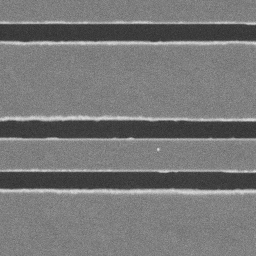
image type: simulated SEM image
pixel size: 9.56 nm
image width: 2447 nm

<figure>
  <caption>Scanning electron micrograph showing lines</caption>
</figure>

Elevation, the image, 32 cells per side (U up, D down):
UUUUUUUUUUUUUUUUUUUUUUUUUUUUUUUU
UUUUUUUUUUUUUUUUUUUUUUUUUUUUUUUU
UUUUUUUUUUUUUUUUUUUUUUUUUUUUUUUU
DDDDDDDDDDDDDDDDDDDDDDDDDDDDDDDD
DDDDDDDDDDDDDDDDDDDDDDDDDDDDDDDD
UUUUUUUUUUUUUUUUUUUUUUUUUUUUUUUU
UUUUUUUUUUUUUUUUUUUUUUUUUUUUUUUU
UUUUUUUUUUUUUUUUUUUUUUUUUUUUUUUU
UUUUUUUUUUUUUUUUUUUUUUUUUUUUUUUU
UUUUUUUUUUUUUUUUUUUUUUUUUUUUUUUU
UUUUUUUUUUUUUUUUUUUUUUUUUUUUUUUU
UUUUUUUUUUUUUUUUUUUUUUUUUUUUUUUU
UUUUUUUUUUUUUUUUUUUUUUUUUUUUUUUU
UUUUUUUUUUUUUUUUUUUUUUUUUUUUUUUU
UUUUUUUUUUUUUUUUUUUUUUUUUUUUUUUU
DDDDDDDDDDDDDDDDDDDDDDDDDDDDDDDD
DDDDDDDDDDDDDDDDDDDDDDDDDDDDDDDD
UUUUUUUUUUUUUUUUUUUUUUUUUUUUUUUU
UUUUUUUUUUUUUUUUUUUUUUUUUUUUUUUU
UUUUUUUUUUUUUUUUUUUUUUUUUUUUUUUU
UUUUUUUUUUUUUUUUUUUUUUUUUUUUUUUU
DDDDDDDDDDDDDDDDDDDDDDDDDDDDDDDD
DDDDDDDDDDDDDDDDDDDDDDDDDDDDDDDD
DDDDDDDDDDDDDDDDDDDDDDDDDDDDDDDD
UUUUUUUUUUUUUUUUUUUUUUUUUUUUUUUU
UUUUUUUUUUUUUUUUUUUUUUUUUUUUUUUU
UUUUUUUUUUUUUUUUUUUUUUUUUUUUUUUU
UUUUUUUUUUUUUUUUUUUUUUUUUUUUUUUU
UUUUUUUUUUUUUUUUUUUUUUUUUUUUUUUU
UUUUUUUUUUUUUUUUUUUUUUUUUUUUUUUU
UUUUUUUUUUUUUUUUUUUUUUUUUUUUUUUU
UUUUUUUUUUUUUUUUUUUUUUUUUUUUUUUU